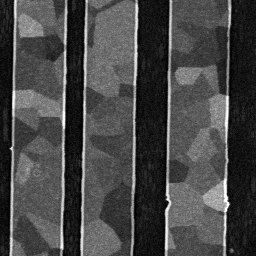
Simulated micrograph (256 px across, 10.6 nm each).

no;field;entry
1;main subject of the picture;one or a few lines or trenches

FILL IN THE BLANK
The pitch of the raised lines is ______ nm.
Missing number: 841